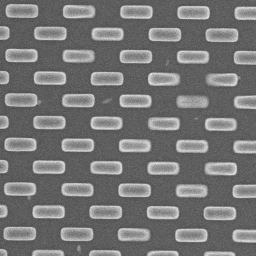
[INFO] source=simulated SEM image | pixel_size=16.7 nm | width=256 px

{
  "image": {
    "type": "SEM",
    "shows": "groups of lines, slits or small figures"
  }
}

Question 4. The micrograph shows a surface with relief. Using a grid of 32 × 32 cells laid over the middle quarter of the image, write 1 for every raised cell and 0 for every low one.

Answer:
00000000000000000000000000000000
00000000000000000000000000000000
00000001111111000000001111000000
00000001111111100000011111110000
00000001111111100000011111110000
00000000000000000000000000000000
00000000000000000000000000000000
00000000000000000000000000000000
11111110000000111111100000000000
11111110000000111111110000000111
00111110000000011111100000000000
00000000000000000000000000000000
00000000000000000000000000000000
00000001111110000000000000000000
00000001111111000000011111111000
00000001111111000000011111111000
00000000000000000000000000000000
00000000000000000000000000000000
00000000000000000000000000000000
11111110000000111111100000000111
11111110000000111111100000001111
11111110000000111111100000001111
00000000000000000000000000000000
00000000000000000000000000000000
00000000000000000000000000000000
00000001111111000000011111110000
00000001111111000000011111110000
00000000000000000000000000000000
00000000000000000000000000000000
00000000000000000000000000000000
11111110000000111111100000000000
11111110000000111111100000001111